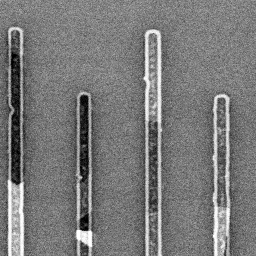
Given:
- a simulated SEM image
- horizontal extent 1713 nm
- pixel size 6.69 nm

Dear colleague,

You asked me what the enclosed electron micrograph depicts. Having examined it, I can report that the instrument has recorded one or a few lines or trenches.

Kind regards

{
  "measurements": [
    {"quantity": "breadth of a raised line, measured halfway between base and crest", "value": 0.0803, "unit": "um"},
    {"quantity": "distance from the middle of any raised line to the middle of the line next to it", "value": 459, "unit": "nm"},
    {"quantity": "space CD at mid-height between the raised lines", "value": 375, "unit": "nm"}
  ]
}